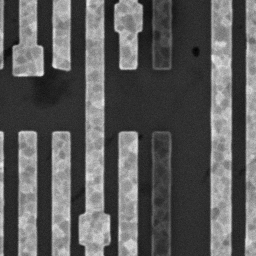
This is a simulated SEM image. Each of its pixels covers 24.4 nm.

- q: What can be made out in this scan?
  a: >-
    wiring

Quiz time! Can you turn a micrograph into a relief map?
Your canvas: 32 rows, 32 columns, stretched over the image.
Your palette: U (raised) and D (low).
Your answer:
DDDUUDDUUDDUUDDUUDDUUDDDDDDUUDDU
DDDUUDDUUDDUUDUUUUDUUDDDDDDUUDDU
DDDUUDDUUDDUUDUUUUDUUDDDDDDUUDDU
DDDUUDDUUDDUUDUUUUDUUDDDDDDUUDDU
DDDUUDDUUDDUUDDUUDDUUDDDDDDUUDDU
DDUUUDDUUDDUUDDUUDDUUDDDDDDUUDDU
DDUUUDDUUDDUUDDUUDDUUDDDDDDUUDDU
DDUUUDDUUDDUUDDUUDDUUDDDDDDUUDDU
DDUUUDDUUDDUUDDUUDDUUDDDDDDUUDDU
DDDDDDDDDDDUUDDDDDDDDDDDDDDUUDDU
DDDDDDDDDDDUUDDDDDDDDDDDDDDUUDDU
DDDDDDDDDDDUUDDDDDDDDDDDDDDUUDDU
DDDDDDDDDDDUUDDDDDDDDDDDDDDUUDDU
DDDDDDDDDDDUUDDDDDDDDDDDDDUUUDDU
DDDDDDDDDDDUUDDDDDDDDDDDDDUUUDDU
DDDDDDDDDDDUUDDDDDDDDDDDDDUUUDDU
DDDUDDDDDDDUUDDDDDDDDDDDDDDUUDDU
DDUUUDDUUDDUUDDUUDDUUDDDDDDUUDDU
DDUUUDDUUDDUUDDUUDDUUDDDDDDUUDDU
DDUUUDDUUDDUUDDUUDDUUDDDDDUUUDDU
DDUUUDDUUDDUUDDUUDDUUDDDDDUUUDDU
DDUUUDDUUDDUUDDUUDDUUDDDDDUUUDDU
DDUUUDDUUDDUUDDUUDDUUDDDDDUUUDDU
DDUUUDDUUDDUUDDUUDDUUDDDDDUUUDDU
DDUUUDDUUDDUUDDUUDDUUDDDDDUUUDDU
DDUUUDDUUDDUUDDUUDDUUDDDDDUUUDDU
DDUUUDDUUDDUUDDUUDDUUDDDDDUUUDDU
DDUUUDDUUDUUUUDUUDDUUDDDDDUUUDDU
DDUUUDDUUDUUUUDUUDDUUDDDDDUUUDDU
DDUUUDDUUDUUUUDUUDDUUDDDDDUUUDDU
DDUUUDDUUDUUUDDUUDDUUDDDDDUUUDDU
DDUUUDDUUDDUUDDUUDDUUDDDDDUUUDDU